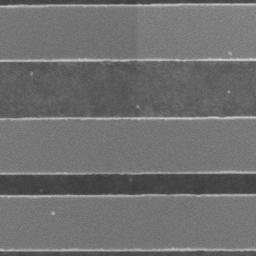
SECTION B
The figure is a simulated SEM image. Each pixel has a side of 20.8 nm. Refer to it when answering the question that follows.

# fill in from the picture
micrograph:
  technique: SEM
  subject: lines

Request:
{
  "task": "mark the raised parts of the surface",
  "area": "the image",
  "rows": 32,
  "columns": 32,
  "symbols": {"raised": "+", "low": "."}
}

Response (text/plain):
................................
++++++++++++++++++++++++++++++++
++++++++++++++++++++++++++++++++
++++++++++++++++++++++++++++++++
++++++++++++++++++++++++++++++++
++++++++++++++++++++++++++++++++
++++++++++++++++++++++++++++++++
++++++++++++++++++++++++++++++++
................................
................................
................................
................................
................................
................................
................................
++++++++++++++++++++++++++++++++
++++++++++++++++++++++++++++++++
++++++++++++++++++++++++++++++++
++++++++++++++++++++++++++++++++
++++++++++++++++++++++++++++++++
++++++++++++++++++++++++++++++++
++++++++++++++++++++++++++++++++
................................
................................
++++++++++++++++++++++++++++++++
++++++++++++++++++++++++++++++++
++++++++++++++++++++++++++++++++
++++++++++++++++++++++++++++++++
++++++++++++++++++++++++++++++++
++++++++++++++++++++++++++++++++
++++++++++++++++++++++++++++++++
................................